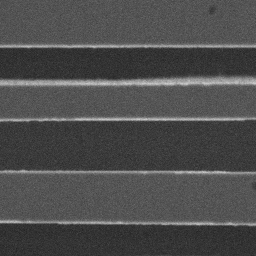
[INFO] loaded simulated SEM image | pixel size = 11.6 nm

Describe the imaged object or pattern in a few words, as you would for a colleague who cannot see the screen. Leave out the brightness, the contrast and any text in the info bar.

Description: lines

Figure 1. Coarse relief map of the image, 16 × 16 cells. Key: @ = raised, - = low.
@@@@@@@@@@@@@@@@
@@@@@@@@@@@@@@@@
@@@@@@@@@@@@@@@@
----------------
----------------
@@@@@@@@@@@@@@@@
@@@@@@@@@@@@@@@@
----------------
----------------
----------------
----------------
@@@@@@@@@@@@@@@@
@@@@@@@@@@@@@@@@
@@@@@@@@@@@@@@@@
----------------
----------------